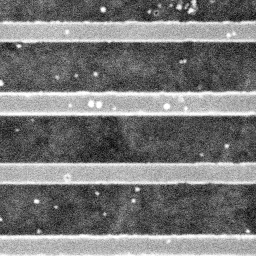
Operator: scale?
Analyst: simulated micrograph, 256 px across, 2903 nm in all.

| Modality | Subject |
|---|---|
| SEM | lines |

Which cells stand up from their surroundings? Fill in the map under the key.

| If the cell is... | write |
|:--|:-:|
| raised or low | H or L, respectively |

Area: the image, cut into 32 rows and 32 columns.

LLLLLLLLLLLLLLLLLLLLLLLLLLLLLLLL
LLLLLLLLLLLLLLLLLLLLLLLLLLLLLLLL
LLLLLLLLLLLLLLLLLLLLLLLLLLLLLLLL
HHHHHHHHHHHHHHHHHHHHHHHHHHHHHHHH
HHHHHHHHHHHHHHHHHHHHHHHHHHHHHHHH
LLLLLLLLLLLLLLLLLLLLLLLLLLLLLLLL
LLLLLLLLLLLLLLLLLLLLLLLLLLLLLLLL
LLLLLLLLLLLLLLLLLLLLLLLLLLLLLLLL
LLLLLLLLLLLLLLLLLLLLLLLLLLLLLLLL
LLLLLLLLLLLLLLLLLLLLLLLLLLLLLLLL
LLLLLLLLLLLLLLLLLLLLLLLLLLLLLLLL
LLLLLLLLLLLLLLLLLLLLLLLLLLLLLLLL
HHHHHHHHHHHHHHHHHHHHHHHHHHHHHHHH
HHHHHHHHHHHHHHHHHHHHHHHHHHHHHHHH
LLLLLLLLLLLLLLLLLLLLLLLLLLLLLLLL
LLLLLLLLLLLLLLLLLLLLLLLLLLLLLLLL
LLLLLLLLLLLLLLLLLLLLLLLLLLLLLLLL
LLLLLLLLLLLLLLLLLLLLLLLLLLLLLLLL
LLLLLLLLLLLLLLLLLLLLLLLLLLLLLLLL
LLLLLLLLLLLLLLLLLLLLLLLLLLLLLLLL
LLLLLLLLLLLLLLLLLLLLLLLLLHHHLLHH
HHHHHHHHHHHHHHHHHHHHHHHHHHHHHHHH
HHHHHHHHHHHHHHHHHHHHHHHHHHHHHHHH
LLLLLLLLLLLLLLLLLLLLLLLLLLLLLLLL
LLLLLLLLLLLLLLLLLLLLLLLLLLLLLLLL
LLLLLLLLLLLLLLLLLLLLLLLLLLLLLLLL
LLLLLLLLLLLLLLLLLLLLLLLLLLLLLLLL
LLLLLLLLLLLLLLLLLLLLLLLLLLLLLLLL
LLLLLLLLLLLLLLLLLLLLLLLLLLLLLLLL
LLLLLLLLLLLLLLLLLLLLLLLLLLLLLLLL
HHHHHHHHHHHHHHHHHHHHHHHHHHHHHHHH
HHHHHHHHHHHHHHHHHHHHHHHHHHHHHHHH